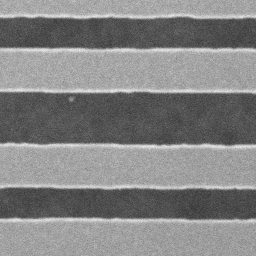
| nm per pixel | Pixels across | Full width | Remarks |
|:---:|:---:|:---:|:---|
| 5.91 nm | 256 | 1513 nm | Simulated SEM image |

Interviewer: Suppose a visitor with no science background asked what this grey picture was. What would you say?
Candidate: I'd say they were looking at lines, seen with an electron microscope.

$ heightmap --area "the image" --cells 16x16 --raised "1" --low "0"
1111111111111111
0000000000000000
0000000000000000
1111111111111111
1111111111111111
1111111111111111
0000000000000000
0000000000000000
0000000000000000
1111111111111111
1111111111111111
1111111111111111
0000000000000000
0000000000000000
1111111111111111
1111111111111111